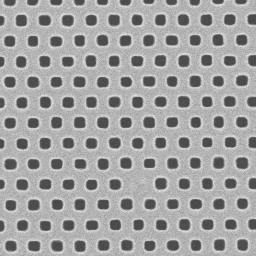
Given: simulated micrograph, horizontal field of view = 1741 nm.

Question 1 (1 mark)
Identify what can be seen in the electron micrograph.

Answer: a regular array of holes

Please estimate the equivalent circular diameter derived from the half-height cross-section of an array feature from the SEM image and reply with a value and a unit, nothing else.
77.9 nm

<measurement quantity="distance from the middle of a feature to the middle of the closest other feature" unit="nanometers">156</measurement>